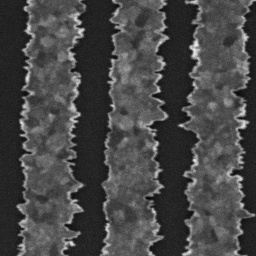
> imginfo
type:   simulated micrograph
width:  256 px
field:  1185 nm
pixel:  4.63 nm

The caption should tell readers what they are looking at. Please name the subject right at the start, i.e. one or a few lines or trenches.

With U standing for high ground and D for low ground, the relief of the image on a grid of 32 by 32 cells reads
DDDUUUUUUUDDDDDUUUUUDDDDDUUUUUUD
DDDUUUUUUUDDDDDUUUUUDDDDDUUUUUUD
DDDDUUUUUUDDDDUUUUUUUDDDDUUUUUUD
DDDUUUUUUUDDDDDUUUUUDDDDDUUUUUDD
DDDDUUUUUUDDDDUUUUUUDDDDUUUUUUUD
DDDDUUUUUDDDDDUUUUUUDDDDUUUUUUUD
DDDUUUUUUDDDDDUUUUUUDDDDUUUUUUUD
DDDUUUUUUDDDDDUUUUUUDDDDDUUUUUUD
DDDDUUUUUDDDDDUUUUUUDDDDUUUUUUUD
DDDUUUUUUUDDDDUUUUUUDDDDUUUUUUUD
DDDUUUUUUUDDDDUUUUUUDDDDUUUUUUUD
DDDUUUUUUUDDDDUUUUUUDDDDUUUUUDDD
DDDUUUUUUDDDDDUUUUUUDDDDUUUUUUDD
DDDUUUUUUDDDDDUUUUUUDDDUUUUUUUUD
DDDUUUUUUUDDDDUUUUUUUDDDUUUUUUDD
DDDUUUUUUDDDDDUUUUUDDDDUUUUUUUUD
DDDUUUUUUDDDDDUUUUUDDDDDUUUUUUDD
DDDUUUUUUDDDDUUUUUUDDDDDDUUUUUDD
DDDUUUUUUDDDDUUUUUUDDDDDUUUUUUDD
DDDUUUUUUDDDDUUUUUUDDDDDUUUUUUDD
DDDUUUUUUDDDDUUUUUUUDDDDUUUUUUDD
DDDUUUUUUDDDDDUUUUUUDDDUUUUUUDDD
DDDUUUUUUUDDDUUUUUUUDDDDUUUUUUDD
DDDUUUUUUUDDDUUUUUUUDDDUUUUUUUDD
DDDUUUUUUDDDDUUUUUDDDDDUUUUUUUDD
DDDUUUUUUUDDDUUUUUUDDDDDUUUUUUDD
DDDUUUUUUUDDDUUUUUUDDDDDUUUUUUUD
DDDUUUUUUDDDDUUUUUUDDDDUUUUUUUDD
DDDUUUUUDDDDDUUUUUUUDDDDUUUUUUDD
DDDUUUUUUUDDDUUUUUUUDDDDUUUUUUDD
DDDUUUUUDDDDDUUUUUUDDDDDUUUUUUDD
DDDUUUUUDDDDDUUUUUUDDDDUUUUUUUDD